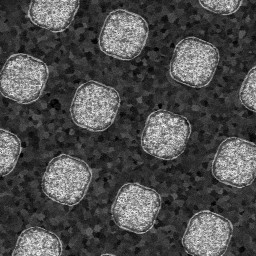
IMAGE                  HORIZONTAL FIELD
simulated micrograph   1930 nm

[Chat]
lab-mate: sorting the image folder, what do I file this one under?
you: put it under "holes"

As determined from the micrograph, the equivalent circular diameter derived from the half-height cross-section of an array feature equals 363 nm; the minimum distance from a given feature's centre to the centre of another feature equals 572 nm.